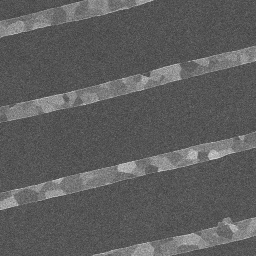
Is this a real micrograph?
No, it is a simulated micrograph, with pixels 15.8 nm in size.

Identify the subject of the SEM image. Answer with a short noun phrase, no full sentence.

one or a few lines or trenches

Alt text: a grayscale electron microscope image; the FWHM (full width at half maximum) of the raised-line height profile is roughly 252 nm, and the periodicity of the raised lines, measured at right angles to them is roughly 1320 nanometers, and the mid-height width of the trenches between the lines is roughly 1070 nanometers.